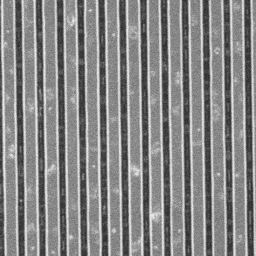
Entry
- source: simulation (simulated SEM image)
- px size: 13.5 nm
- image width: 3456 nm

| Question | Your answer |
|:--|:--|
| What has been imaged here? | parallel lines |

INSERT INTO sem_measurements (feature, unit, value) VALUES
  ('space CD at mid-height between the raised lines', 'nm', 103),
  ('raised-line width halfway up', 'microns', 0.172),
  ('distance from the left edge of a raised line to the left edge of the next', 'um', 0.281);